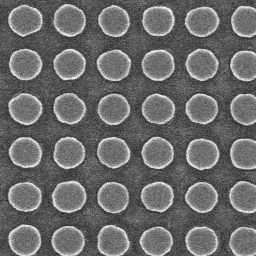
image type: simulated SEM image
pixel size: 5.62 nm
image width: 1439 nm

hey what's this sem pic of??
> a regular array of raised bodies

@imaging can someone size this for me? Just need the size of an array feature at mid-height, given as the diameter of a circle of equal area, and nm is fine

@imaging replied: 174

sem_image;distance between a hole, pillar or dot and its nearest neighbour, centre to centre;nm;246